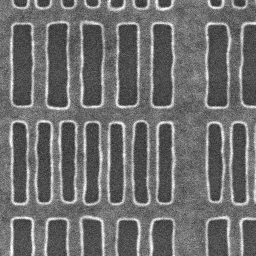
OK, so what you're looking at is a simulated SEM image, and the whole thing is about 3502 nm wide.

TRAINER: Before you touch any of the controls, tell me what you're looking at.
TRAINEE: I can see groups of lines, slits or small figures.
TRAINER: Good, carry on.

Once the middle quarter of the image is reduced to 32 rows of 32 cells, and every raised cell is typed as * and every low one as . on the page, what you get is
.***......***......***.....*****
.***......***......***.....*****
.***......***......***.....*****
.***......***......***.....*****
.***......***......***.....*****
.***......***......***.....*****
.***......***......***.....*****
.***......***......***.....*****
.***......***......***.....*****
.***......***.....****.....*****
.****....*****...******...******
********************************
********************************
********************************
..*****************.************
...**....**....**....***...*****
...**....**....**....**....*****
...**....**....**....**....*****
...**....**....**....**....*****
...**....**....**....**....*****
...**....**....**....**....*****
...**....**....**....**....*****
...**....**....**....**....*****
...**....**....**....**....*****
...**....**....**....**....*****
...**....**....**....**....*****
...**....**....**....**....*****
...**....**....**....**....*****
...**....**....**....**....*****
...**....**....**....**....*****
...**....**....**....**....*****
...**....**....**....**....*****